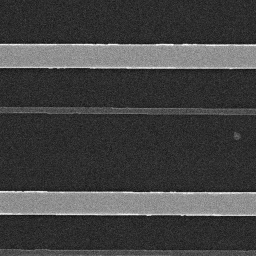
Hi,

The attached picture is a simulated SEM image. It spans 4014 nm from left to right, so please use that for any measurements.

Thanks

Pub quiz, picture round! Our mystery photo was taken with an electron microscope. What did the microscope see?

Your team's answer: lines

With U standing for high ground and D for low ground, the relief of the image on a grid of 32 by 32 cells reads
DDDDDDDDDDDDDDDDDDDDDDDDDDDDDDDD
DDDDDDDDDDDDDDDDDDDDDDDDDDDDDDDD
DDDDDDDDDDDDDDDDDDDDDDDDDDDDDDDD
DDDDDDDDDDDDDDDDDDDDDDDDDDDDDDDD
DDDDDDDDDDDDDDDDDDDDDDDDDDDDDDDD
DDDDDDDDDDDDDDDDDDDDDDDDDDDDDDDD
UUUUUUUUUUUUUUUUUUUUUUUUUUUUUUUU
UUUUUUUUUUUUUUUUUUUUUUUUUUUUUUUU
DDDDDDDDDDDDDDDDDDDDDUUUUUUUUUUU
DDDDDDDDDDDDDDDDDDDDDDDDDDDDDDDD
DDDDDDDDDDDDDDDDDDDDDDDDDDDDDDDD
DDDDDDDDDDDDDDDDDDDDDDDDDDDDDDDD
DDDDDDDDDDDDDDDDDDDDDDDDDDDDDDDD
DDDDDDDDDDDDDDDDDDDDDDDDDDDDDDDD
DDDDDDDDDDDDDDDDDDDDDDDDDDDDDDDD
DDDDDDDDDDDDDDDDDDDDDDDDDDDDDDDD
DDDDDDDDDDDDDDDDDDDDDDDDDDDDDDDD
DDDDDDDDDDDDDDDDDDDDDDDDDDDDDDDD
DDDDDDDDDDDDDDDDDDDDDDDDDDDDDDDD
DDDDDDDDDDDDDDDDDDDDDDDDDDDDDDDD
DDDDDDDDDDDDDDDDDDDDDDDDDDDDDDDD
DDDDDDDDDDDDDDDDDDDDDDDDDDDDDDDD
DDDDDDDDDDDDDDDDDDDDDDDDDDDDDDDD
DDDDDDDDDDDDDDDDDDDDDDDDDDDDDDDD
UUUUUUUUUUUUUUUUUUUUUUUUUUUUUUUU
UUUUUUUUUUUUUUUUUUUUUUUUUUUUUUUU
UUUUUUUUUUUUUUUUUUUUUUUUUUUUUUUU
DDDDDDDDDDDDDDDDDDDDDDDDDDDDDDDD
DDDDDDDDDDDDDDDDDDDDDDDDDDDDDDDD
DDDDDDDDDDDDDDDDDDDDDDDDDDDDDDDD
DDDDDDDDDDDDDDDDDDDDDDDDDDDDDDDD
UUUUUUUUUUUUUUUUUUUUUUUUUUUUUUUU